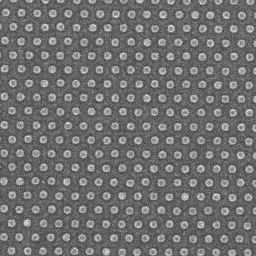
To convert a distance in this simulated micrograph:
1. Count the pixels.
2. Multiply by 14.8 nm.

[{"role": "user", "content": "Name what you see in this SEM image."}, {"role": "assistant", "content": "a regular array of raised bodies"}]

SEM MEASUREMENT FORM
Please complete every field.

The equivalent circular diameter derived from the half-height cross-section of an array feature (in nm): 103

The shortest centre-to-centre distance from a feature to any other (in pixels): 15.3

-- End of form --